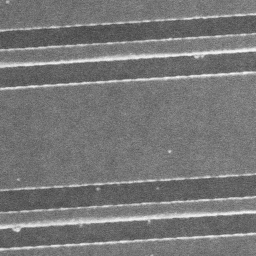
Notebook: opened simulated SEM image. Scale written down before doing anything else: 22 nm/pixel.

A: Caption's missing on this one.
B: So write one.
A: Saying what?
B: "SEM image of lines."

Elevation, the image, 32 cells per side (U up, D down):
UUUUUUUUUUUUUUUUUUUUUUUUUUUUUUUU
UUUUUUUUUUUUUUUUUUUUUUUUUUUUUUUU
UUUUUUUUUUUUUUUUUUUUUDDDDDDDDDDD
UUUUUUDDDDDDDDDDDDDDDDDDDDDDDDDD
DDDDDDDDDDDDDDDDDDDDDDDDDDDDUUUU
DDDDDDDDDDDUUUUUUUUUUUUUUUUUUUUU
UUUUUUUUUUUUUUUUUUUUUUUUUUUUDDDD
UUUUUUUUUUUUUDDDDDDDDDDDDDDDDDDD
DDDDDDDDDDDDDDDDDDDDDDDDDDDDDDDD
DDDDDDDDDDDDDDDDDDDDDDDUUUUUUUUU
DDDDDDDDUUUUUUUUUUUUUUUUUUUUUUUU
UUUUUUUUUUUUUUUUUUUUUUUUUUUUUUUU
UUUUUUUUUUUUUUUUUUUUUUUUUUUUUUUU
UUUUUUUUUUUUUUUUUUUUUUUUUUUUUUUU
UUUUUUUUUUUUUUUUUUUUUUUUUUUUUUUU
UUUUUUUUUUUUUUUUUUUUUUUUUUUUUUUU
UUUUUUUUUUUUUUUUUUUUUUUUUUUUUUUU
UUUUUUUUUUUUUUUUUUUUUUUUUUUUUUUU
UUUUUUUUUUUUUUUUUUUUUUUUUUUUUUUU
UUUUUUUUUUUUUUUUUUUUUUUUUUUUUUUU
UUUUUUUUUUUUUUUUUUUUUUUUUUUUUUUU
UUUUUUUUUUUUUUUUUUUUUUUUUUUUUUUU
UUUUUUUUUUUUUUUUUUUUUUDDDDDDDDDD
UUUUUDDDDDDDDDDDDDDDDDDDDDDDDDDD
DDDDDDDDDDDDDDDDDDDDDDDDDDDDDDDD
DDDDDDDDDDDDDDDDDUUUUUUUUUUUUUUU
DDUUUUUUUUUUUUUUUUUUUUUUUUUUUUUD
UUUUUUUUUUUUUUUDDDDDDDDDDDDDDDDD
DDDDDDDDDDDDDDDDDDDDDDDDDDDDDDDD
DDDDDDDDDDDDDDDDDDDDDDDDDDDUUUUU
DDDDDDDDDDUUUUUUUUUUUUUUUUUUUUUU
UUUUUUUUUUUUUUUUUUUUUUUUUUUUUUUU